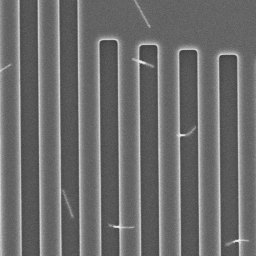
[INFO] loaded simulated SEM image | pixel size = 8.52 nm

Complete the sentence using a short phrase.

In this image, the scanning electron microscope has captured groups of lines, slits or small figures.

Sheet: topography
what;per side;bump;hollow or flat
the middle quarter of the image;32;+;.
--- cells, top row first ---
....+++++.....+++++.....+++++...
....+++++.....+++++.....+++++...
....+++++.....+++++.....+++++...
....+++++.....+++++.....+++++...
....+++++.....+++++.....+++++...
....+++++.....+++++.....+++++...
....+++++.....+++++.....+++++...
....+++++.....+++++.....+++++...
....+++++.....+++++.....+++++...
....+++++.....+++++.....+++++...
....+++++.....+++++.....+++++...
....+++++.....+++++.....+++++...
....+++++.....+++++.....+++++...
....+++++.....+++++.....+++++...
....+++++.....+++++.....+++++...
....+++++.....+++++.....+++++...
....+++++.....+++++.....+++++...
....+++++.....+++++.....+++++...
....+++++.....+++++.....+++++...
....+++++.....+++++.....+++++...
....+++++.....+++++.....+++++...
....+++++.....+++++.....+++++...
....+++++.....+++++.....+++++...
....+++++.....+++++.....+++++...
....+++++.....+++++.....+++++...
....+++++.....+++++.....+++++...
....+++++.....+++++.....+++++...
....+++++.....+++++.....+++++...
....+++++.....+++++.....+++++...
....+++++.....+++++.....+++++...
....+++++.....+++++.....+++++...
....+++++.....+++++.....+++++...